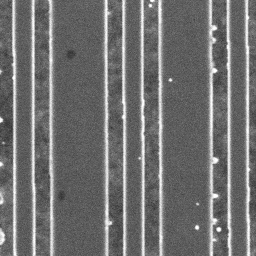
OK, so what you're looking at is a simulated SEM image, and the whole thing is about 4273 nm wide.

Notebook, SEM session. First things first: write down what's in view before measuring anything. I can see lines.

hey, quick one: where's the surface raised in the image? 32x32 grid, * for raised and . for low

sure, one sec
..**..*******..***..******..***.
..**..*******..***..******..***.
..**..*******..***..******..***.
..**..*******..***..******..***.
..**..*******..***..******..***.
..**..*******..***..******..***.
..**..*******..***..******..***.
..**..*******..***..******...**.
..**..*******..***..*******..**.
..**..*******..***..******...**.
..**..*******..***..******...**.
..**..*******..***..******...**.
..**..*******..***..******...**.
..**..*******...**..******...**.
..**..*******..***..******...**.
..**..*******...**..******...**.
..**..*******...**..******...**.
..**..*******...**..******...**.
..**..*******...**..******...**.
..**..*******...**..*******..**.
..**..*******...**..*******..**.
..**..*******...**..******...**.
..**..*******...**..******...**.
..**..*******...**..******...**.
..**..*******...**..*******..**.
..**..*******...**..******...**.
..**..*******...**..******...**.
..**..*******...**..*******..**.
..**..*******...**..******...**.
..**..*******...**..******...**.
..**..*******...**..******...**.
..**..*******...**..******...**.